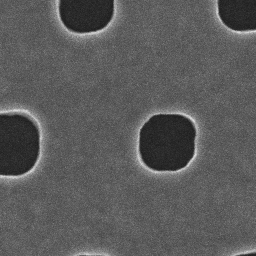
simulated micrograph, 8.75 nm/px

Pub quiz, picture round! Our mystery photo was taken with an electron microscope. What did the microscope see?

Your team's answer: holes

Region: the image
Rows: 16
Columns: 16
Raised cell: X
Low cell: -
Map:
XXXX---XXXXXXX--
XXXX---XXXXXXX--
XXXXXXXXXXXXXXXX
XXXXXXXXXXXXXXXX
XXXXXXXXXXXXXXXX
XXXXXXXXXXXXXXXX
XXXXXXXXXXXXXXXX
--XXXXXXX---XXXX
--XXXXXXX---XXXX
--XXXXXXX---XXXX
--XXXXXXX--XXXXX
XXXXXXXXXXXXXXXX
XXXXXXXXXXXXXXXX
XXXXXXXXXXXXXXXX
XXXXXXXXXXXXXXXX
XXXXXXXXXXXXXXXX